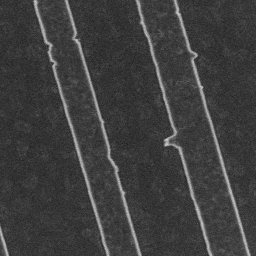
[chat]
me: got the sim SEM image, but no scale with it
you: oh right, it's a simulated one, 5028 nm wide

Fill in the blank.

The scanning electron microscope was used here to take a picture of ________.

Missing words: one or a few lines or trenches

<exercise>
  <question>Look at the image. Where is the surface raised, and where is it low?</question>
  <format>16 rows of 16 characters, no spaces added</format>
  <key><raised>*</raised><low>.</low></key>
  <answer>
..**.....**.....
...**....**.....
...**....***....
...**.....**....
...**.....**....
....**....***...
....**....***...
....**.....**...
.....**....**...
.....**....***..
.....**.....**..
.....**.....**..
......**....***.
......**....***.
......**.....**.
.......**....**.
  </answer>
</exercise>